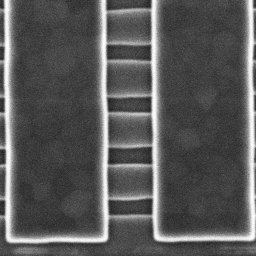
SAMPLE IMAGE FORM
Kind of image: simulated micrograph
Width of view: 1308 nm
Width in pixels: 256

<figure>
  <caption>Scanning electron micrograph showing wiring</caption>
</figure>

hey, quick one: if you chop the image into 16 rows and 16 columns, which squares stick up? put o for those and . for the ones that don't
ooooooo...oooooo
ooooooo...oooooo
ooooooo...oooooo
ooooooo...oooooo
ooooooo...oooooo
ooooooo...oooooo
ooooooo...oooooo
ooooooo...oooooo
ooooooo...oooooo
ooooooo...oooooo
ooooooo...oooooo
ooooooo...oooooo
ooooooo...oooooo
ooooooo...oooooo
ooooooo...oooooo
................